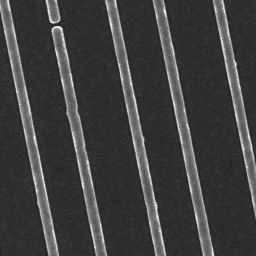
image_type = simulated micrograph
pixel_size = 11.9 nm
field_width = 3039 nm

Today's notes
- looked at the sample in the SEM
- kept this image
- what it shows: parallel lines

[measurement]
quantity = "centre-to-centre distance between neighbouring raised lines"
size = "618 nm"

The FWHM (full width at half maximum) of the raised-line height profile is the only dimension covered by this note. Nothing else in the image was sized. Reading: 116 nm